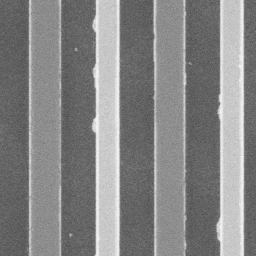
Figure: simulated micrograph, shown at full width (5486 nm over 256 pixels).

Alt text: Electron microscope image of lines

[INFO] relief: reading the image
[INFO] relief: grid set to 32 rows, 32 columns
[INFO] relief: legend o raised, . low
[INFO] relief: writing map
....oooo....ooo....oooo.....oo..
....oooo....ooo....oooo.....oo..
....oooo....ooo....oooo.....oo..
....oooo....ooo....oooo.....oo..
....oooo....ooo....oooo.....oo..
....oooo....ooo....oooo.....oo..
....oooo....ooo....oooo.....oo..
....oooo....ooo....oooo.....oo..
....oooo....ooo....oooo.....oo..
....oooo....ooo....oooo.....oo..
....oooo....ooo....oooo.....oo..
....oooo....ooo....oooo.....oo..
....oooo....ooo....oooo.....oo..
....oooo....ooo....oooo.....oo..
....oooo....ooo....oooo.....oo..
....oooo....ooo....oooo.....oo..
....oooo....ooo....oooo.....oo..
....oooo....ooo....oooo.....oo..
....oooo....ooo....oooo.....oo..
....oooo....ooo....oooo.....oo..
....oooo....ooo....oooo.....oo..
....oooo....ooo....oooo.....oo..
....oooo....ooo....oooo.....oo..
....oooo....ooo....oooo.....oo..
....oooo....ooo....oooo.....oo..
....oooo....ooo....oooo.....oo..
....oooo....ooo....oooo.....oo..
....oooo....ooo....oooo.....oo..
....oooo....ooo....oooo.....oo..
....oooo....ooo....oooo.....oo..
....oooo....ooo....oooo.....oo..
....oooo....ooo....oooo.....oo..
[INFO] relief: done